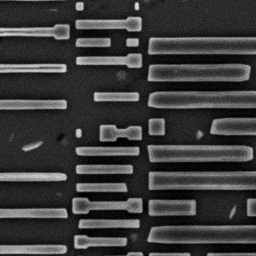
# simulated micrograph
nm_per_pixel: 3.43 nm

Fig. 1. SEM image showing wiring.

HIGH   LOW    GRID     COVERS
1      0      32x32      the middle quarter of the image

10000000000000001110001111111111
10000000000000000000011111111111
00000000000000000000011111111111
00000000000000000000011111111111
00000000000000000000000000000000
00000000000000000000000000000000
00000000000000000000000000000000
00000000111111111110001111111111
00000000111111111110011111111111
10000000000000000000011111111111
10000000000000000000001111111111
00000000000000000000000000000000
00000000000000000000000000000000
00000000000000000000000000000000
00000000000000000000011110000000
00000000011110000000011110000000
00010000011111111110011110000000
00010000011111111110001110000000
00000000011110001110000000000000
00000000000000000000000000000000
00000000000000000000011000000000
00011111111111111110011111111111
00001111111111111110011111111111
00000000000000000000011111111111
00000000000000000000001100000000
00011111111111111000000000000000
00011111111111111000000000000000
00000000000000000000011111111111
10000000000000000000011111111111
00000000000000000000011111111111
00011111111111110000011111111111
00011111111111110000000000000000